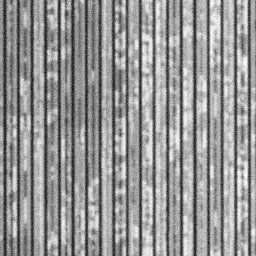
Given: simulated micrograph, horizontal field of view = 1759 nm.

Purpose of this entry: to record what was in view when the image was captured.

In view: parallel lines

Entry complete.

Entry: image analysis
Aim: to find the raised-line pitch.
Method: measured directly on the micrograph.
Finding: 46.4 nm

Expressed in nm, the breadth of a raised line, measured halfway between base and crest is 27.5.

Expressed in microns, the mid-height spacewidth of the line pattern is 0.0275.